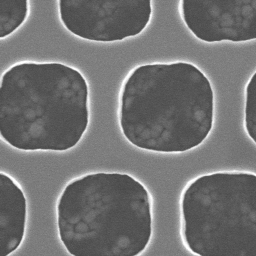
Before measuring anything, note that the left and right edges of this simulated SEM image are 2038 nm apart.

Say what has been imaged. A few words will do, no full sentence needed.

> holes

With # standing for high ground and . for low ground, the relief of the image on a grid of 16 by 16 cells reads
..##.....##.....
.###.....###....
######.######..#
################
.....###.....###
.....###.....##.
.....###.....##.
......##.....##.
.....###.....###
################
################
.###.....###....
..##.....##.....
..##.....##.....
.###.....##.....
.###.....###....